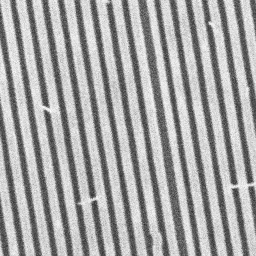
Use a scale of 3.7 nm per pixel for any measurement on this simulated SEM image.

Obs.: parallel lines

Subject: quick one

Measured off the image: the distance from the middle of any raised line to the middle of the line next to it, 58.4 nm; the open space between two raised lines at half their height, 26.4 nm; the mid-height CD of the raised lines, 0.0301 um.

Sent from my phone